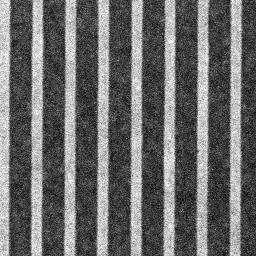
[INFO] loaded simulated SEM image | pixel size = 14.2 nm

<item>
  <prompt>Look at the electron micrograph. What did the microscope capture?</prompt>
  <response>parallel lines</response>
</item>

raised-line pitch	469	nm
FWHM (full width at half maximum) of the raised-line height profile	0.131	µm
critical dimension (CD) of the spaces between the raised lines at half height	342	nm